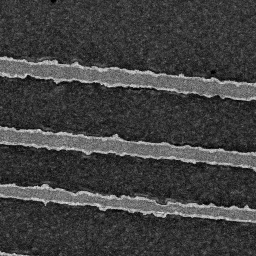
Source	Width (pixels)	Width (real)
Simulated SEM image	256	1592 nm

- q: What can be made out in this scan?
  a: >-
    one or a few lines or trenches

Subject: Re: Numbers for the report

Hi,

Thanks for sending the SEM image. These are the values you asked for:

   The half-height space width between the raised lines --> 49.2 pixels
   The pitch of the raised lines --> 386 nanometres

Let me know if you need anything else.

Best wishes